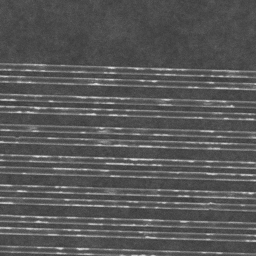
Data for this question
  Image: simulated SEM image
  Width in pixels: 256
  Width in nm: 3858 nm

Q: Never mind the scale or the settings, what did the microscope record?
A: parallel lines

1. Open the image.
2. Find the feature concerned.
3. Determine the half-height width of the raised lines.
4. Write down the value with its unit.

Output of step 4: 6.62 px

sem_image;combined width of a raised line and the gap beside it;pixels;15